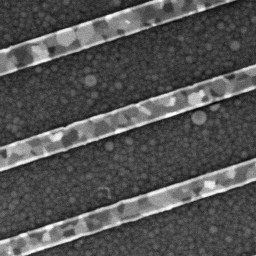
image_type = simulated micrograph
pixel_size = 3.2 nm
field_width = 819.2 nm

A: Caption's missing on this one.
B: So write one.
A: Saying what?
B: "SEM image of one or a few lines or trenches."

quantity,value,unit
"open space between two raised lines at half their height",68.9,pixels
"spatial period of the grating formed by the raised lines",287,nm